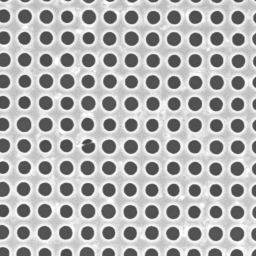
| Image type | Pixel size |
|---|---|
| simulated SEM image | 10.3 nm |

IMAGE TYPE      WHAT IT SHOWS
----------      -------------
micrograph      a regular array of holes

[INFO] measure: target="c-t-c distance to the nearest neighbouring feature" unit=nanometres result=218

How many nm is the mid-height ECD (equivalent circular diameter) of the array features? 144